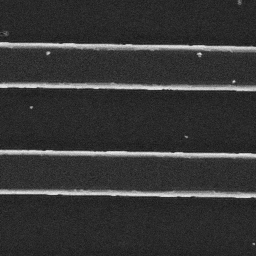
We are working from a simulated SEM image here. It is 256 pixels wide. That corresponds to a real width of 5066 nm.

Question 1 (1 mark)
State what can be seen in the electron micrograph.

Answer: lines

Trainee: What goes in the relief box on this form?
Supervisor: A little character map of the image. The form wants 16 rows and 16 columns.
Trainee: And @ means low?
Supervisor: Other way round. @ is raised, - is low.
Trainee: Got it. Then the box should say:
----------------
----------------
----------------
@@@@@@@@@@@@@@@@
@@@@@@@@@@@@@@@@
------------@@@@
----------------
----------------
----------------
@---------------
@@@@@@@@@@@@@@@@
@@@@@@@@@@@@@@@@
----------------
----------------
----------------
----------------